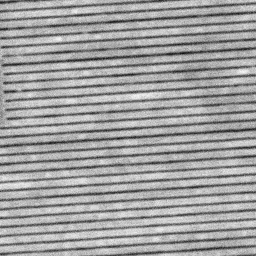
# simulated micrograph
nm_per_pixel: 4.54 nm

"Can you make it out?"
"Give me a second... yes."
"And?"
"parallel lines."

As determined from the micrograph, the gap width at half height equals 9.1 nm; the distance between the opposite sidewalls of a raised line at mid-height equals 6.72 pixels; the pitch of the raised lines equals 40.7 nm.